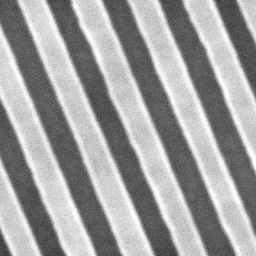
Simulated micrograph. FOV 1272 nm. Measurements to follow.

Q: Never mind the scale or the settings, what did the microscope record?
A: lines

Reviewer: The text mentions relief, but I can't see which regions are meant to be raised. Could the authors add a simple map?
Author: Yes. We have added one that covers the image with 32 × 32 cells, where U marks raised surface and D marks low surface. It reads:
DDUUUUDDDUUUUDDDUUUUDDDUUUUDDDUU
DDDUUUDDDDUUUDDDDUUUDDDDUUUDDDUU
DDDUUUUDDDUUUUDDDUUUUDDDUUUUDDDU
DDDDUUUDDDUUUUDDDUUUUDDDUUUUDDDU
DDDDUUUUDDDUUUUDDDUUUDDDDUUUDDDD
UDDDDUUUDDDUUUUDDDUUUUDDDUUUUDDD
UDDDDUUUDDDDUUUDDDDUUUDDDDUUUDDD
UUDDDUUUUDDDUUUUDDDUUUUDDDUUUUDD
UUDDDDUUUDDDDUUUDDDDUUUDDDDUUUDD
UUUDDDUUUUDDDUUUUDDDUUUUDDDUUUUD
UUUDDDDUUUDDDUUUUDDDUUUUDDDDUUUD
UUUDDDDUUUUDDDUUUDDDDUUUDDDDUUUD
UUUUDDDUUUUDDDUUUUDDDUUUUDDDUUUU
DUUUDDDDUUUDDDDUUUDDDDUUUDDDDUUU
DUUUUDDDUUUUDDDUUUUDDDUUUUDDDUUU
DDUUUDDDDUUUDDDUUUUDDDDUUUDDDDUU
DDUUUDDDDUUUUDDDUUUDDDDUUUDDDDUU
DDUUUUDDDDUUUDDDUUUUDDDUUUUDDDUU
DDDUUUDDDDUUUDDDDUUUDDDDUUUDDDDU
DDDUUUUDDDUUUUDDDUUUUDDDUUUUDDDU
DDDDUUUDDDDUUUDDDDUUUDDDDUUUDDDD
UDDDUUUUDDDUUUUDDDUUUUDDDUUUUDDD
UDDDUUUUDDDUUUUDDDUUUUDDDDUUUDDD
UUDDDUUUDDDDUUUUDDDUUUDDDDUUUDDD
UUDDDUUUUDDDUUUUDDDUUUUDDDUUUUDD
UUDDDDUUUDDDDUUUDDDDUUUDDDDUUUDD
UUUDDDUUUUDDDUUUUDDDUUUUDDDUUUUD
UUUDDDDUUUDDDDUUUDDDDUUUDDDDUUUD
UUUUDDDUUUDDDDUUUUDDDUUUDDDDUUUD
UUUUDDDUUUUDDDUUUUDDDDUUUDDDDUUU
DUUUDDDDUUUDDDDUUUUDDDUUUDDDDUUU
DUUUUDDDUUUUDDDUUUUDDDUUUUDDDUUU